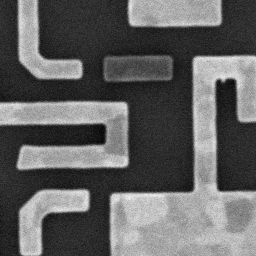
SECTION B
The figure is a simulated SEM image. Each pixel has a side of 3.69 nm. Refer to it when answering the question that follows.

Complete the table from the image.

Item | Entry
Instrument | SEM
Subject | wiring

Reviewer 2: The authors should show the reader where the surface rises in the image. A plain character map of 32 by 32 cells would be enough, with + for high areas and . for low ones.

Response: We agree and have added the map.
..+++...........+++++++++++.....
..+++...........++++++++++++....
..+++...........++++++++++++....
..+++...........................
..+++...........................
..+++...........................
..+++...........................
...+++.......++++++++...++++++++
...+++++++...++++++++...++++++++
....++++++...++++++++...++++++++
........................+++...++
........................+++...++
........................+++...++
++++++++++++++++........+++...++
++++++++++++++++........+++...++
++++.........+++........+++.....
.............+++........+++.....
.............+++........+++.....
...+++++++++++++........+++.....
..++++++++++++++........+++.....
..++++++++++++++........+++.....
........................+++.....
........................+++.....
........................+++.....
....+++++++...++++++++++++++++++
...++++++++...++++++++++++++++++
..+++++.......++++++++++++++++++
..+++.........++++++++++++++++++
..+++.........++++++++++++++++++
..+++.........++++++++++++++++++
...++.........++++++++++++++++++
...++.........++++++++++++++++++